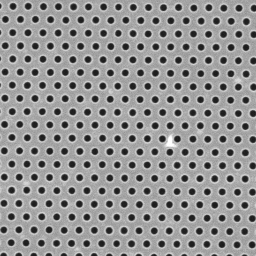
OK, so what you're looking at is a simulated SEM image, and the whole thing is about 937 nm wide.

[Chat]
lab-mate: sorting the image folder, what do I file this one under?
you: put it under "a regular array of holes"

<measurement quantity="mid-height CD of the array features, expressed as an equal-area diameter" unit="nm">25.1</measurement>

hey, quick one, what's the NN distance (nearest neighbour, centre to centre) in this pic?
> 53.2 nanometers